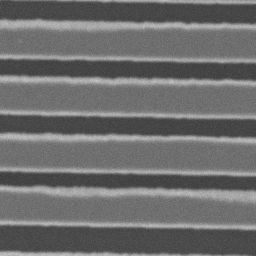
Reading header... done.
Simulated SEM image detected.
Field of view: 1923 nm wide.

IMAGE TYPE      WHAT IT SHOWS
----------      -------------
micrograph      lines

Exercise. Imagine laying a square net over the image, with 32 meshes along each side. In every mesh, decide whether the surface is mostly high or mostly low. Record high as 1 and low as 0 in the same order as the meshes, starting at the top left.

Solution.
00000000000000000000000000000000
00000000000000000000000000000000
00000000000000000000000000000000
11111111111111111111111111111111
11111111111111111111111111111111
11111111111111111111111111111111
11111111111111111111111111111111
00000000000000001111111111111111
00000000000000000000000000000000
00000000000000000000000000000000
11111111111111111111111111111111
11111111111111111111111111111111
11111111111111111111111111111111
11111111111111111111111111111111
00000000000000111111111111111111
00000000000000000000000000000000
00000000000000000000000000000000
11111111111111111111111111111111
11111111111111111111111111111111
11111111111111111111111111111111
11111111111111111111111111111111
00000000000111111111111111111111
00000000000000000000000000000000
11111100000000000000000000000000
11111111111111111111111111111111
11111111111111111111111111111111
11111111111111111111111111111111
11111111111111111111111111111111
00000000000000000000000001111111
00000000000000000000000000000000
00000000000000000000000000000000
00000000000000000000000000000000